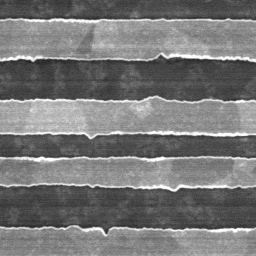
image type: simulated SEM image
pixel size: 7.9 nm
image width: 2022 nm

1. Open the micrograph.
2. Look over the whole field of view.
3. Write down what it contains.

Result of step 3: one or a few lines or trenches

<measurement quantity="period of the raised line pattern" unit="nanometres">525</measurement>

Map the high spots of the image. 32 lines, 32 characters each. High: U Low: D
DDDDDDDDDDDDDDDDDDDDDDDDDDDDDDDD
DDDDDDDDDDDDDDDDDDDDDDDDDDDDDDDD
UUUUDDUUUUDDDDDDUUUUUUUUUUUDUDDD
UUUUUUUUUUUUUUUUUUUUUUUUUUUUUUUU
UUUUUUUUUUUUUUUUUUUUUUUUUUUUUUUU
UUUUUUUUUUUUUUUUUUUUUUUUUUUUUUUU
UUUUUUUUUUUUUUUUUUUUUUUUUUUUUUUU
UDDDDDDDDDDDDDDDUDUDDDDDDDDDDDUU
DDDDDDDDDDDDDDDDDDDDDDDDDDDDDDDD
DDDDDDDDDDDDDDDDDDDDDDDDDDDDDDDD
DDDDDDDDDDDDDDDDDDDDDDDDDDDDDDDD
DDDDDDDDDDDDDDDDDDDDDDDDDDDDDDDD
DDDDUUDUDDUUDDDDDDUUUDDDDDUDDDDD
UUUUUUUUUUUUUUUUUUUUUUUUUUUUUUUU
UUUUUUUUUUUUUUUUUUUUUUUUUUUUUUUU
UUUUUUUUUUUUUUUUUUUUUUUUUUUUUUUU
UUUUUUUUUUUUUUUUUUUUUUUUUUUUUUUU
DDDDDDDDDDDDDDDDDDDDDDDDDDDDDDDD
DDDDDDDDDDDDDDDDDDDDDDDDDDDDDDDD
DDDDDDDDDDDDDDDDDDDDDDDDDDDDDDDD
UUUUUUUUUUUUUUUUUUUUUUUUUUUUUUUU
UUUUUUUUUUUUUUUUUUUUUUUUUUUUUUUU
UUUUUUUUUUUUUUUUUUUUUUUUUUUUUUUU
DDDDDDDDDDDDDDDDDUUUUUDDDDDDDDDD
DDDDDDDDDDDDDDDDDDDDDDDDDDDDDDDD
DDDDDDDDDDDDDDDDDDDDDDDDDDDDDDDD
DDDDDDDDDDDDDDDDDDDDDDDDDDDDDDDD
DDDDDDDDDDDDDDDDDDDDDDDDDDDDDDDD
UUDDDUUDUUDDDDUUDDDDDDDDDDDDDDDD
UUUUUUUUUUUUUUUUUUUUUUUUUUUUUUUU
UUUUUUUUUUUUUUUUUUUUUUUUUUUUUUUU
UUUUUUUUUUUUUUUUUUUUUUUUUUUUUUUU